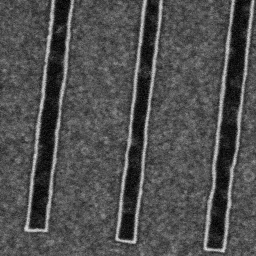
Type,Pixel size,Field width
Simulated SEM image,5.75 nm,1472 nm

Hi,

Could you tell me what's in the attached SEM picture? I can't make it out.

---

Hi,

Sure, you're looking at one or a few lines or trenches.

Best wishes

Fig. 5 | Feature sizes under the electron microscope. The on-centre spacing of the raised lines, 0.513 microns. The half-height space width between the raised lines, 410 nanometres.